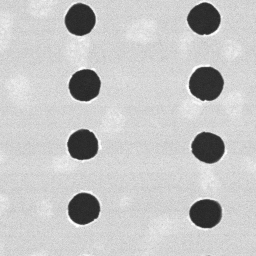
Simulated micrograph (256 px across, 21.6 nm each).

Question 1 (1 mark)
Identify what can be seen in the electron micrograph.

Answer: a regular array of holes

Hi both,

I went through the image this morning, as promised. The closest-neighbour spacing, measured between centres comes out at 1380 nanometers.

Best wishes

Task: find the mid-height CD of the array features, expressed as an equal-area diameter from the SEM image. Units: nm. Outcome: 702